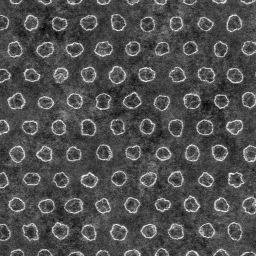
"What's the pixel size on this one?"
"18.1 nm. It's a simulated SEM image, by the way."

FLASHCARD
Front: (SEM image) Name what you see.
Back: a regular array of raised bodies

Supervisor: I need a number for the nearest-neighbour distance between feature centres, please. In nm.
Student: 514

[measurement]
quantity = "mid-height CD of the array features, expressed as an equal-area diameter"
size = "261 nm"